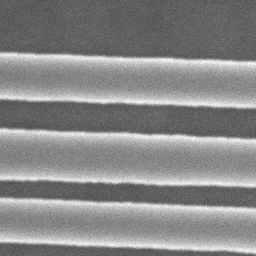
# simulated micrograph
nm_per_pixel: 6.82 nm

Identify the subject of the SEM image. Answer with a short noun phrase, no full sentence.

lines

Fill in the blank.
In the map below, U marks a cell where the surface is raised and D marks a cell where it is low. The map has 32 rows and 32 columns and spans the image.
DDDDDDDDDDDDDDDDDDDDDDDDDDDDDDDD
DDDDDDDDDDDDDDDDDDDDDDDDDDDDDDDD
DDDDDDDDDDDDDDDDDDDDDDDDDDDDDDDD
DDDDDDDDDDDDDDDDDDDDDDDDDDDDDDDD
DDDDDDDDDDDDDDDDDDDDDDDDDDDDDDDD
DDDDDDDDDDDDDDDDDDDDDDDDDDDDDDDD
DDDDDDDDDDDDDDDDDDDDDDDDDDDDDDDD
UUUUUUUUUUUUUUUUUUUUUUUDDDDDDDDD
UUUUUUUUUUUUUUUUUUUUUUUUUUUUUUUU
UUUUUUUUUUUUUUUUUUUUUUUUUUUUUUUU
UUUUUUUUUUUUUUUUUUUUUUUUUUUUUUUU
UUUUUUUUUUUUUUUUUUUUUUUUUUUUUUUU
DDDUUUUUUUUUUUUUUUUUUUUUUUUUUUUU
DDDDDDDDDDDDDDDDDDDDDDDDDDDDDDDD
DDDDDDDDDDDDDDDDDDDDDDDDDDDDDDDD
DDDDDDDDDDDDDDDDDDDDDDDDDDDDDDDD
UUUUUUUDDDDDDDDDDDDDDDDDDDDDDDDD
UUUUUUUUUUUUUUUUUUUUUUUUUUUUUUUU
UUUUUUUUUUUUUUUUUUUUUUUUUUUUUUUU
UUUUUUUUUUUUUUUUUUUUUUUUUUUUUUUU
UUUUUUUUUUUUUUUUUUUUUUUUUUUUUUUU
UUUUUUUUUUUUUUUUUUUUUUUUUUUUUUUU
DDUUUDUUUUUUUUUUUUUUUUUUUUUUUUUU
DDDDDDDDDDDDDDDDDDDDDDDDDDDDDDDD
DDDDDDDDDDDDDDDDDDDDDDDDDDDDDDDD
UUUUUUUUUUUUUUUUUDDDDDDDDDDDDDDD
UUUUUUUUUUUUUUUUUUUUUUUUUUUUUUUU
UUUUUUUUUUUUUUUUUUUUUUUUUUUUUUUU
UUUUUUUUUUUUUUUUUUUUUUUUUUUUUUUU
UUUUUUUUUUUUUUUUUUUUUUUUUUUUUUUU
DDDDDDDDUUUUUUUUUUUUUUUUUUUUUUUU
DDDDDDDDDDDDDDDDDDDDDDDDDDDDDDUU